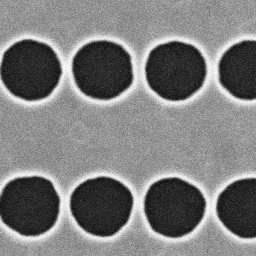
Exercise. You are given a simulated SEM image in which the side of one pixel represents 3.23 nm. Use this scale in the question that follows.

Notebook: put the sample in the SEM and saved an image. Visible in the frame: holes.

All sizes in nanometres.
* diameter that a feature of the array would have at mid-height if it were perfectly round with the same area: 198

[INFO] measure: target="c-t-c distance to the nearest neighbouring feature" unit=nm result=234